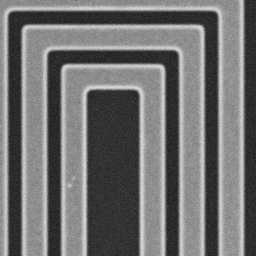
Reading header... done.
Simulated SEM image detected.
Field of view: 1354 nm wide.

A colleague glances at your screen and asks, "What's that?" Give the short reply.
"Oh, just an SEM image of groups of lines, slits or small figures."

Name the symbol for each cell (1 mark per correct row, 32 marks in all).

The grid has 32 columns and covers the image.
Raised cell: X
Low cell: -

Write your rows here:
XXXXXXXXXXXXXXXXXXXXXXXXXXXXXX--
X--------------------------XXX--
X--------------------------XXX--
X--XXXXXXXXXXXXXXXXXXXXXX--XXX--
X--XXXXXXXXXXXXXXXXXXXXXX--XXX--
X--XXXXXXXXXXXXXXXXXXXXXX--XXX--
X--XXX----------------XXX--XXX--
X--XXX-----------------XX--XXX--
X--XXX--XXXXXXXXXXXX---XX--XXX--
X--XXX--XXXXXXXXXXXXX--XX--XXX--
X--XXX--XXXXXXXXXXXXX--XX--XXX--
X--XXX--XXX------XXXX--XX--XXX--
X--XXX--XXX-------XXX--XX--XXX--
X--XXX--XXX-------XXX--XX--XXX--
X--XXX--XXX-------XXX--XX--XXX--
X--XXX--XXX-------XXX--XX--XXX--
X--XXX--XXX-------XXX--XX--XXX--
X--XXX--XXX-------XXX--XX--XXX--
X--XXX--XXX-------XXX--XX--XXX--
X--XXX--XXX-------XXX--XX--XXX--
X--XXX--XXX-------XXX--XX--XXX--
X--XXX--XXX-------XXX--XX--XXX--
X--XXX--XXX-------XXX--XX--XXX--
X--XXX--XXX-------XXX--XX--XXX--
X--XXX--XXX-------XXX--XX--XXX--
X--XXX--XXX-------XXX--XX--XXX--
X--XXX--XXX-------XXX--XX--XXX--
X--XXX--XXX-------XXX--XX--XXX--
X--XXX--XXX-------XXX--XX--XXX--
X--XXX--XXX-------XXX--XX--XXX--
X--XXX--XXX-------XXX--XX--XXX--
X--XXX--XXX-------XXX--XX--XXX--